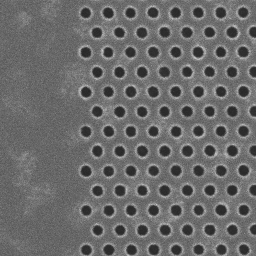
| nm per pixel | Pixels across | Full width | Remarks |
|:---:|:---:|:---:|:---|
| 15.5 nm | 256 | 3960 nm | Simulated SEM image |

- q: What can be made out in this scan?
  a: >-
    a regular array of holes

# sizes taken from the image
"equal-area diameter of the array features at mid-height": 172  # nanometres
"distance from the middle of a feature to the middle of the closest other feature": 342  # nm